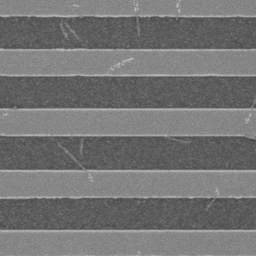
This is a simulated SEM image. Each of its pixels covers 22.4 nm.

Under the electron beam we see lines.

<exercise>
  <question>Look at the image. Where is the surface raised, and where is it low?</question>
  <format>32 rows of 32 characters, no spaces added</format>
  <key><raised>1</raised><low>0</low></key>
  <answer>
11111111111111111111111111111111
11111111111111111111111111111111
00000000000000000000000000000000
00000000000000000000000000000000
00000000000000000000000000000000
00000000000000000000000000000000
11111111111111111111111111111111
11111111111111111111111111111111
11111111111111111111111111111111
00000000000000000000000000000000
00000000000000000000000000000000
00000000000000000000000000000000
00000000000000000000000000000000
00000000000000000000000000000000
11111111111111111111111111111111
11111111111111111111111111111111
11111111111111111111111111111111
00000000000000000000000000000000
00000000000000000000000000000000
00000000000000000000000000000000
00000000000000000000000000000000
11111111111111111111111111111111
11111111111111111111111111111111
11111111111111111111111111111111
11111111111111111111111111111111
00000000000000000000000000000000
00000000000000000000000000000000
00000000000000000000000000000000
00000000000000000000000000000000
11111111111111111111111111111111
11111111111111111111111111111111
11111111111111111111111111111111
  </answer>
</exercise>